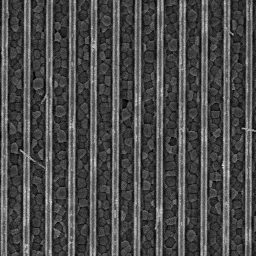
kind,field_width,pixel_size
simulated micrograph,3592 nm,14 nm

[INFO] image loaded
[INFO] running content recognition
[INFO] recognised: parallel lines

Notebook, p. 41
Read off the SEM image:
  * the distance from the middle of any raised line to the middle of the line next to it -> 312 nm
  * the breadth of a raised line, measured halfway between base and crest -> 0.0736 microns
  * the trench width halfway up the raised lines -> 0.244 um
